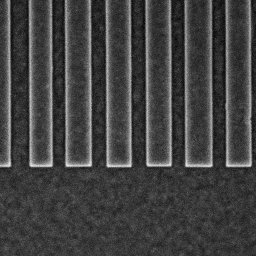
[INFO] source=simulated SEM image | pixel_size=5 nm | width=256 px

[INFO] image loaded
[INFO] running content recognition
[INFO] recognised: parallel lines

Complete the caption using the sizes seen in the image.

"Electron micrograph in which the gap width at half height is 77.5 nanometres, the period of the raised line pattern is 198 nm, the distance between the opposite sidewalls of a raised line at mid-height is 120 nm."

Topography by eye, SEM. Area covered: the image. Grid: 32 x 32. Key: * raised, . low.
*...**..***..***..***..***..***.
*...**..***..***..***..***..***.
*...**..***..***..***..***..***.
*...**..***..***..***..***..***.
*...**..***..***..***..***..***.
*...**..***..***..***..***..***.
*...**..***..***..***..***..***.
*...**..***..***..***..***..***.
*...***.***..***..***..***..***.
*...**..***..***..***..***..***.
*...**..***..***..***..***..***.
*...**..***..***..***..***..***.
*...**..***..***..***..***..***.
*...**..***..***..***..***..***.
*...**..***..***..***..***..***.
*...**..***..***..***..***..***.
*...**..***..***..***..***..***.
*...**..***..***..***..***..***.
*...**..***..***..***..***..***.
*...**..***..***..***..***..***.
*...**..***..***...**..***..***.
................................
................................
................................
................................
................................
................................
................................
................................
................................
................................
................................